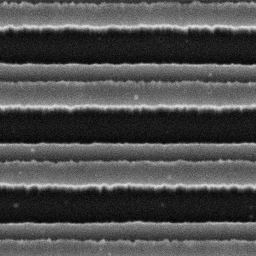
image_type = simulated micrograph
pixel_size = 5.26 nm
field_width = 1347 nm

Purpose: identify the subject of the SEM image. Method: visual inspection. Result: lines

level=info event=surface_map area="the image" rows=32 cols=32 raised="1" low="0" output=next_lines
11111111111111111111111111111111
11111111111111111111111111111111
11111111111111111111111111111111
10000000000110000000001000100101
00000000000000000000000000000000
00000000000000000000000000000000
00000000000000000000000000000000
00000000000000000000000000000000
11111111111111111111111111111111
11111111111111111111111111111111
11111111111111111111111111111111
11111111111111111111111111111111
11111111111111111111111111111111
00000000000000000000000000000000
00000000000000000000000000000000
00000000000000000000000000000000
00000000000000000000000000000000
00000000000000000000000000000000
11111111111111111111111111111111
11111111111111111111111111111111
11111111111111111111111111111111
11111111111111111111111111111111
11111111111111111111111111111111
00000000000000000000000000000000
00000000000000000000000000000000
00000000000000000000000000000000
00000000000000000000000000000000
00000000000000000000000000000000
11111111111111111111111111111111
11111111111111111111111111111111
11111111111111111111111111111111
11111111111111111111111111111111